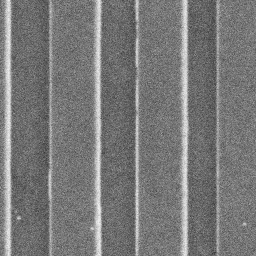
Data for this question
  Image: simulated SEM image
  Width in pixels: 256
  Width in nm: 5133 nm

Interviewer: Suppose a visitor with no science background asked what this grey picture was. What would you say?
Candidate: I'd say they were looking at lines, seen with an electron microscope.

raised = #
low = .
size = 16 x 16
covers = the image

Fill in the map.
#..###...###..##
#..###...###..##
#..###...###..##
#..###...###..##
#..###...###..##
#..###...###..##
#..###...###..##
#..###...###..##
#..###...###..##
#..###...###..##
#..###...###..##
#..###...###..##
#..###...###..##
#..###...###..##
#..###...###..##
#..###...###..##